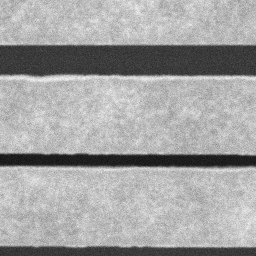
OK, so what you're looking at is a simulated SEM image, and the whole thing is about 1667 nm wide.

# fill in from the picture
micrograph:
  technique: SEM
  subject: lines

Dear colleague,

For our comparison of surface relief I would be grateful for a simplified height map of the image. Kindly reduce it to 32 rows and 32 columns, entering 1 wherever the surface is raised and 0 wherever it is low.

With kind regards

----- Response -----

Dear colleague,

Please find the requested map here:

11111111111111111111111111111111
11111111111111111111111111111111
11111111111111111111111111111111
11111111111111111111111111111111
11111111111111111111111111111111
11111111111111111111111111111111
00000000000000000000000000000000
00000000000000000000000000000000
00000000000000000000000000000000
00000000000000000000000000000000
11111111111111111111111111111111
11111111111111111111111111111111
11111111111111111111111111111111
11111111111111111111111111111111
11111111111111111111111111111111
11111111111111111111111111111111
11111111111111111111111111111111
11111111111111111111111111111111
11111111111111111111111111111111
00000000000000000000000000000000
00000000000000000000000000000000
11111111111111111111111111111111
11111111111111111111111111111111
11111111111111111111111111111111
11111111111111111111111111111111
11111111111111111111111111111111
11111111111111111111111111111111
11111111111111111111111111111111
11111111111111111111111111111111
11111111111111111111111111111111
11111111111111111111111111111111
00000000000000000000000000000000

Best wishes